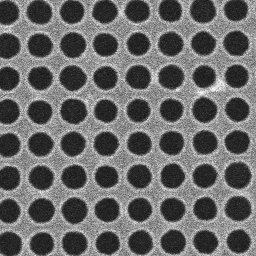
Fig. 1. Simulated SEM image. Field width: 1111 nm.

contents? a regular array of holes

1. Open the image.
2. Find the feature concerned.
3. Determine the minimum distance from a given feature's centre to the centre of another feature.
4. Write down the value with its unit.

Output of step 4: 141 nanometres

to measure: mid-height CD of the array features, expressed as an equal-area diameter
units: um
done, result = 0.105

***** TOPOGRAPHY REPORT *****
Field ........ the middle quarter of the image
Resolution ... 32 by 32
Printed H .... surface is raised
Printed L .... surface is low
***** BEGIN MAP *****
HLLHHHHHHHHHHHHHHLLHHHHHHHLLHHHH
LLLLLHHHLLLLLHHHLLLLLHHHLLLLLHHH
LLLLLHHLLLLLLHHHLLLLLHHHLLLLLLHH
LLLLLLHLLLLLLHHLLLLLLLHLLLLLLLHH
LLLLLHHHLLLLLHHHLLLLLHHHLLLLLLHH
LLLLLHHHLLLLLHHHLLLLLHHHHLLLLHHH
HLLHHHHHHHLHHHHHHHHHHHHHHHHHHHHH
HHHHHHHHHHHHHHHHHHHHHHHHHHHHHHHH
HHHHHHHHHHHHHHHHHHHHHHHHHHHHHHHH
LLLLLHHHHLLLHHHHHLLLLHHHHLLLLHHH
LLLLLLHHLLLLLHHHLLLLLHHHLLLLLLHH
LLLLLLHHLLLLLHHHLLLLLLHHLLLLLLHH
LLLLLLHHLLLLLHHHLLLLLHHHLLLLLLHH
LLLLLHHHLLLLLHHHLLLLLHHHHLLLLHHH
HLLLHHHHHHLLHHHHHHLHHHHHHHHHHHHH
HHHHHHHHHHHHHHHHHHHHHHHHHHHHHHHH
HHHHHHHHHHHHHHHHHHHHHHHHHHHHHHHH
HLLLHHHHHLLLHHHHHLLLHHHHHLLLLHHH
LLLLLHHHLLLLLHHHLLLLLHHHLLLLLLHH
LLLLLHHHLLLLLLHHLLLLLLHHLLLLLLHH
LLLLLHHLLLLLLLHHLLLLLLHHLLLLLLHH
LLLLLHHHLLLLLHHHLLLLLHHHLLLLLHHH
LLLLHHHHHLLLHHHHHLLLHHHHHHLLHHHH
HHHHHHHHHHHHHHHHHHHHHHHHHHHHHHHH
HHHHHHHHHHHHHHHHHHHHHHHHHHHHHHHH
HLLLHHHHHHLHHHHHHLLLHHHHHLLLLHHH
LLLLLHHHLLLLLHHHLLLLLHHHLLLLLLHH
LLLLLHHHLLLLLLHHLLLLLLHHLLLLLLHH
LLLLLLHHLLLLLLHHLLLLLLHHLLLLLLHH
LLLLLLHHLLLLLLHHLLLLLLHHLLLLLLHH
LLLLLHHHHLLLHHHHHLLLLHHHHLLLLHHH
HHHHHHHHHHHHHHHHHHHHHHHHHHHHHHHH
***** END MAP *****